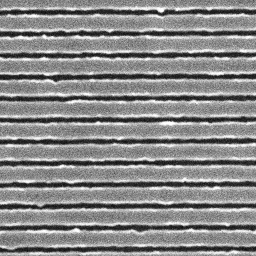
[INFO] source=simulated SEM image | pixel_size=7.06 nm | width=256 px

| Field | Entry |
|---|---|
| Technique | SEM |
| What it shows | parallel lines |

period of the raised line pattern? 0.152 microns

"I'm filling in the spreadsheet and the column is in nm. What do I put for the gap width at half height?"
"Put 38.8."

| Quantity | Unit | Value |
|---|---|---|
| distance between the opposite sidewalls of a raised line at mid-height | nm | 114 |